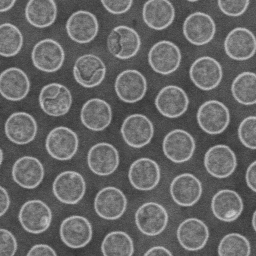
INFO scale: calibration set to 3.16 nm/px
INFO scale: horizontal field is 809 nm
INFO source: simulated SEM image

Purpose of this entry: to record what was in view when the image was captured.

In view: a regular array of raised bodies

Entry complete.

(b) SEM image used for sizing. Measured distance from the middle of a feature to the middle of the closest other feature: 0.139 um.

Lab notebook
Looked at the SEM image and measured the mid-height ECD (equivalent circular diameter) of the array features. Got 30.9 pixels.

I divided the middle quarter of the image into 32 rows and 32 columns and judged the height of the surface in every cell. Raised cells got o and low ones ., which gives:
......................oooooo....
...o....oo.............oooo.....
...o...ooo....ooooo.............
...o...ooo....oooooo............
....ooooo....ooooooo............
.....oo......ooooooo............
.............ooooooo.....oooo...
..............oooooo....oooooo..
..............ooooo....oooooooo.
......oooo.............oooooooo.
.....oooooo............oooooooo.
.....oooooo.............oooooo..
....oooooooo.............oooo...
....oooooooo....oooo............
.....oooooo....oooooo...........
......ooooo....ooooooo..........
o.......o......ooooooo..........
oo.............ooooooo....ooooo.
ooo............ooooooo...ooooooo
ooo.............ooooo....ooooooo
ooo.....oooo......o......ooooooo
ooo....oooooo............ooooooo
oo....ooooooo............ooooooo
o.....ooooooo.............ooooo.
......ooooooo.....oooo..........
......ooooooo....oooooo.........
.......ooooo.....oooooo.........
ooo......oo.....oooooooo........
oooo............oooooooo....oooo
ooooo............oooooo....ooooo
ooooo.............oooo.....ooooo
ooooo.....ooo..............ooooo